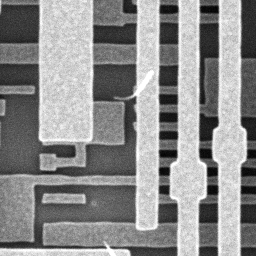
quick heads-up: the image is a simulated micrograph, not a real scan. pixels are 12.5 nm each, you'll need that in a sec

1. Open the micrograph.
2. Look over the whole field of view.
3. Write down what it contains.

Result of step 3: wiring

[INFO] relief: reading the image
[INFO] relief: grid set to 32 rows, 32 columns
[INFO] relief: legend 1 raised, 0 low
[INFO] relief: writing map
00000111111100000111001110001100
00000111111100000111001110001100
00000111111100000111001110001100
00000111111100000111001110011100
00000111111100000111001110011100
00000111111100000111001110001100
00000111111100000111001110001100
00000111111100000111001110011100
00000111111100000111001110011100
00000111111100000111001110011100
00000111111100000111001110011100
00000111111100000111001110011100
00000111111100000111001110011100
00000111111100000111001110011100
00000111111100000111001110011100
00000111111100000111001110011100
00000111111100000111001110011110
00000111111000000111001110011110
00000000000000000111001110011110
00000000000000000111001110011110
00000000000000000111001110011100
00000000000000000111011111011100
00000000000000000111011111011100
00000000000000000111011111011100
00000000000000000111011111011100
00000000000000000111001110011100
00000000000000000111001110011100
00000000000000000111001110011100
00000000000000000110001110011100
00000000000000000000001110011100
00000000000000000000001110011100
11111111111111110000001110011100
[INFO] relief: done